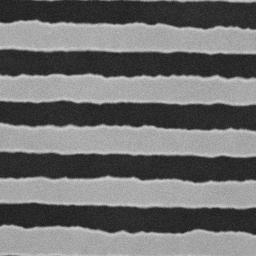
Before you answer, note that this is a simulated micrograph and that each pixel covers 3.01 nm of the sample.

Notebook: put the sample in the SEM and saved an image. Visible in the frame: lines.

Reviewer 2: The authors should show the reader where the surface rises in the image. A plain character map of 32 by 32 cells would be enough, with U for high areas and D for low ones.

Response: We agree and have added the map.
DDDDDDDDDDDDDDDDDDDDDDDDDDDDDDDD
DDDDDDDDDDDDDDDDDDDDDDDDDDDDDDDD
DDDDUDDDDDDDDDDDDDDDDDDDDDDDDDDD
UUUUUUUUUUUUUUUUUUUUUUUUUDUUUUDD
UUUUUUUUUUUUUUUUUUUUUUUUUUUUUUUU
UUUUUUUUUUUUUUUUUUUUUUUUUUUUUUUU
DDDDDDDDDDDDDDDDDDDDUUDUUUUUUUUU
DDDDDDDDDDDDDDDDDDDDDDDDDDDDDDDD
DDDDDDDDDDDDDDDDDDDDDDDDDDDDDDDD
UDUUUUUUUUUUUDDDDUDDDUUUUDDDDDDD
UUUUUUUUUUUUUUUUUUUUUUUUUUUUUUUU
UUUUUUUUUUUUUUUUUUUUUUUUUUUUUUUU
UUUUUUUUUUUUUUUUUUUUUUUUUUUUUUUU
DDDDDDDDDDDDDDDDDDDDDDDDDDDDDDDD
DDDDDDDDDDDDDDDDDDDDDDDDDDDDDDDD
UDDDDDDDDDDDDDDDDDDDDDDDDDDDDDDD
UUUUUUUUUUUUUUUUUUUUUUUUUUUUUUUU
UUUUUUUUUUUUUUUUUUUUUUUUUUUUUUUU
UUUUUUUUUUUUUUUUUUUUUUUUUUUUUUUU
DDDDDDDDDDDDDDDDDDDDDDDDUUUUUUUU
DDDDDDDDDDDDDDDDDDDDDDDDDDDDDDDD
DDDDDDDDDDDDDDDDDDDDDDDDDDDDDDDD
UUUUUUUUUUUUUUUUUUUUUUUDDDDDDDDU
UUUUUUUUUUUUUUUUUUUUUUUUUUUUUUUU
UUUUUUUUUUUUUUUUUUUUUUUUUUUUUUUU
DDDDDUUUUUUUUUUUUUUUUUUUUUUUUUUU
DDDDDDDDDDDDDDDDDDDDDDDDDDDDDDDD
DDDDDDDDDDDDDDDDDDDDDDDDDDDDDDDD
UUUDUUUUUUUDDDDDDDDDDDDDDDDDDDDD
UUUUUUUUUUUUUUUUUUUUUUUUUUUUUUUU
UUUUUUUUUUUUUUUUUUUUUUUUUUUUUUUU
UUUUUUUUUUUUUUUUUUUUUUUUUUUUUUUU